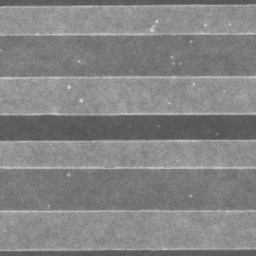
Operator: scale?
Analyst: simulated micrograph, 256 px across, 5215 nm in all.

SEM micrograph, lines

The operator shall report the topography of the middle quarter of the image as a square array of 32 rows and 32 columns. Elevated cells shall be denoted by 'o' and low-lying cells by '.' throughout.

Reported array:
................................
................................
................................
oooooooooooooooooooooooooooooooo
oooooooooooooooooooooooooooooooo
oooooooooooooooooooooooooooooooo
oooooooooooooooooooooooooooooooo
oooooooooooooooooooooooooooooooo
oooooooooooooooooooooooooooooooo
oooooooooooooooooooooooooooooooo
oooooooooooooooooooooooooooooooo
oooooooooooooooooooooooooooooooo
oooooooooooooooooooooooooooooooo
................................
................................
................................
................................
................................
................................
oooooooooooooooooooooooooooooooo
oooooooooooooooooooooooooooooooo
oooooooooooooooooooooooooooooooo
oooooooooooooooooooooooooooooooo
oooooooooooooooooooooooooooooooo
oooooooooooooooooooooooooooooooo
oooooooooooooooooooooooooooooooo
................................
................................
................................
................................
................................
................................